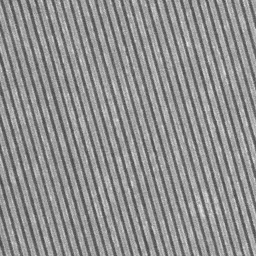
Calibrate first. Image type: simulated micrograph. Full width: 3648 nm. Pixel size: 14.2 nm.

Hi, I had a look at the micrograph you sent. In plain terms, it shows parallel lines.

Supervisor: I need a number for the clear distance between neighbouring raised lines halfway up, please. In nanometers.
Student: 53.2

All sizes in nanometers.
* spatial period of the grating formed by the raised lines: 117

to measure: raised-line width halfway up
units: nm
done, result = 65.1